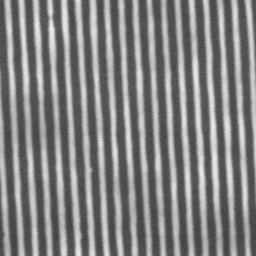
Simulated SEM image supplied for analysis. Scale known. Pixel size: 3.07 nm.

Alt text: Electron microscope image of parallel lines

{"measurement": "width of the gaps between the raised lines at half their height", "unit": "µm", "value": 0.0284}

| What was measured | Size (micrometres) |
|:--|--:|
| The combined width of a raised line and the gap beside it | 0.0435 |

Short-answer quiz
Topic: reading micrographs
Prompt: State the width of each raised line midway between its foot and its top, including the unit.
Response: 15.7 nm